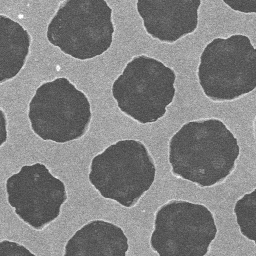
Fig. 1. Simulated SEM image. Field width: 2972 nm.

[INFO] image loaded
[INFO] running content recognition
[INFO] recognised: holes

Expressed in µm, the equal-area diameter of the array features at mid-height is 0.724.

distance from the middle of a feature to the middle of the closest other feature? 994 nm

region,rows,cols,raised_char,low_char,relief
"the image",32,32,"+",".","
++++++++.....++++........+++....
+++++++.......+++........+++++..
.+++++........++++.......+++++++
...+++........++++......++++++++
....++........+++++....++++++.++
....+++.......++++++++++++.....+
...+++++.....++++++++++++.......
...++++++++++++++...+++++.......
...+++++++++++++.....++++.......
..+++++++++++++.......+++.......
++++++...+++++........+++.......
++++......++++........++++.....+
++++.......++++.......++++++++++
++++.......++++......+++++++++++
.+++.......+++++....++++++++++++
.+++.......++++++++++++.....++++
.+++.......+++++++++++.......+++
.+++++...++++++++++++.........++
+++++++++++++.....+++.........++
++++++++++++.......++.........++
+++++++++++........++........+++
++....+++++........+++.......+++
+......++++........+++++....++++
+.......++++.......+++++++++++++
+.......+++++.....+++++++++++++.
+.......+++++++..++++...+++++...
++.....+++++++++++++......+++...
+++....++++++++++++........+++..
++++.+++++.....++++........+++..
+++++++++.......+++........++++.
..++++++........+++.......++++++
....++++........++++......++++++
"